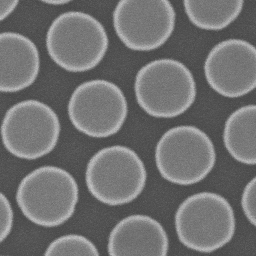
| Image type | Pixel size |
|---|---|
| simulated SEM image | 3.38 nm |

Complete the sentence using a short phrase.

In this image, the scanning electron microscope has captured a regular array of raised bodies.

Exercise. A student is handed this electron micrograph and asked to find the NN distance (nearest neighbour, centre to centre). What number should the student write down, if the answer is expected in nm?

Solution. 235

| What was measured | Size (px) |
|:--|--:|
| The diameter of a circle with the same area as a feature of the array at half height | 56.2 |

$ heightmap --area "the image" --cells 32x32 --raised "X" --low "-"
XX-------------XXXXXX--XXXXXXX--
X--------------XXXXXX---XXXXXX--
-------XXXXX--XXXXXXXX--XXXXX---
------XXXXXXX--XXXXXX-----X-----
XX----XXXXXXX--XXXXXX-----------
XXXX--XXXXXXX---XXXX--------XXX-
XXXXX-XXXXXXX--------------XXXXX
XXXXX--XXXXX--------------XXXXXX
XXXXX---XXX-------XXXXX---XXXXXX
XXXX-------------XXXXXXX--XXXXXX
XXXX-------XXX---XXXXXXX--XXXXXX
---------XXXXXX--XXXXXXX----XXX-
---------XXXXXX--XXXXXXX--------
--XXXX---XXXXXXX--XXXXX--------X
-XXXXXX--XXXXXXX-------------XXX
-XXXXXX--XXXXXX-------------XXXX
XXXXXXX----XXX-------XXXX---XXXX
-XXXXXX-------------XXXXXX--XXXX
-XXXXX--------X-----XXXXXX--XXXX
---XX-------XXXXX---XXXXXXX--XXX
-----------XXXXXXX--XXXXXXX-----
----XXXX---XXXXXXX--XXXXXX------
---XXXXXX--XXXXXXX---XXXX-------
---XXXXXX--XXXXXX--------------X
--XXXXXXXX--XXXXX--------XX----X
X--XXXXXX--------------XXXXX--XX
X--XXXXXX-------------XXXXXXX--X
X---XXXX--------XXX---XXXXXXX--X
X--------------XXXXX--XXXXXXX---
--------------XXXXXXX-XXXXXXX---
-------XXXX---XXXXXXX--XXXXX----
------XXXXXX--XXXXXXX-----------